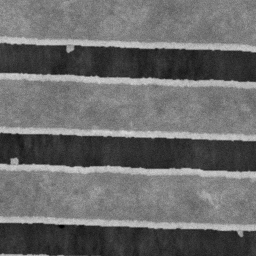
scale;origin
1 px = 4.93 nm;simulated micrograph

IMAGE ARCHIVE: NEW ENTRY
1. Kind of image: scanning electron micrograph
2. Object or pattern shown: lines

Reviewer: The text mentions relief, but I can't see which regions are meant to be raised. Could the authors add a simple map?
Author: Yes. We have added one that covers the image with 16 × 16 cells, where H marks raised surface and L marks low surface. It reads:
HHHHHHHHHHHHHHHH
HHHHHHHHHHHHHHHH
HHHHHHHHHHHHHHHH
LLLLLLLLLLLLLLLL
LLLLLLLLLLLLLLLL
HHHHHHHHHHHHHHHH
HHHHHHHHHHHHHHHH
HHHHHHHHHHHHHHHH
LLLLLLLLLLLHHHHH
LLLLLLLLLLLLLLLL
HHHHLLLLLLLLLLLL
HHHHHHHHHHHHHHHH
HHHHHHHHHHHHHHHH
HHHHHHHHHHHHHHHH
LLLLLLLLLLLLLLLL
LLLLLLLLLLLLLLLL